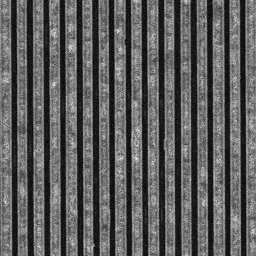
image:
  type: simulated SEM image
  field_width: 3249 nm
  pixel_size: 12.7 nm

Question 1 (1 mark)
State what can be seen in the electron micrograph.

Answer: parallel lines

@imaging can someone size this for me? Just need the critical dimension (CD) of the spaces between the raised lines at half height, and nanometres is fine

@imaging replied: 92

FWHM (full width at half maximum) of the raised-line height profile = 114 nm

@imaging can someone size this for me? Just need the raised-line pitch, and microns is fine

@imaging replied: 0.208